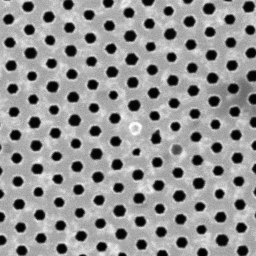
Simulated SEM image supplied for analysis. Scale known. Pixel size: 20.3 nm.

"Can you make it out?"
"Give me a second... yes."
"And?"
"a regular array of holes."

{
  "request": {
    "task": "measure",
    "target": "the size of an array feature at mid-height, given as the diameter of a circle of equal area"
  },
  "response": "232 nm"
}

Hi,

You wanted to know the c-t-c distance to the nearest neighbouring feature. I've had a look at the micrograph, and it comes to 466 nm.